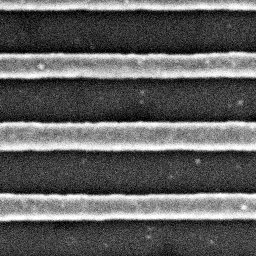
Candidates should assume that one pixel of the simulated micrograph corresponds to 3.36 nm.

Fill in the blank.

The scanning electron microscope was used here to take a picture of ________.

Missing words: lines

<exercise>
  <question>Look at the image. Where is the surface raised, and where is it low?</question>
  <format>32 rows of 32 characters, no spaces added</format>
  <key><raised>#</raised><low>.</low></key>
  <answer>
################################
................................
................................
................................
................................
................................
................................
################################
################################
######..............##..........
................................
................................
................................
................................
................................
#####...#.######################
################################
################################
###.###...############.#########
................................
................................
................................
................................
................................
###########..###..##############
################################
################################
................................
................................
................................
................................
................................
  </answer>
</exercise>